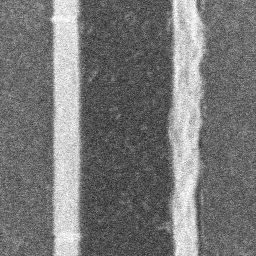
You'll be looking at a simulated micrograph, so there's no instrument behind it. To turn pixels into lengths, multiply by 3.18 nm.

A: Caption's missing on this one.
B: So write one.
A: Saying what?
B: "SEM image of one or a few lines or trenches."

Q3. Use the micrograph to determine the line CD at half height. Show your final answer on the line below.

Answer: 385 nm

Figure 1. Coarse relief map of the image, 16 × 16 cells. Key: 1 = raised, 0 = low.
0000111111110000
0000111111110000
0000111111110000
0000111111110000
0000111111110000
0000111111110000
0000111111110000
0000111111110000
0000111111110000
0000111111110000
0000111111110000
0000111111110000
0000111111110000
0000111111110000
0000111111110000
0000111111110000